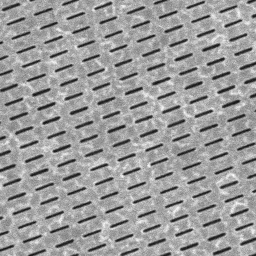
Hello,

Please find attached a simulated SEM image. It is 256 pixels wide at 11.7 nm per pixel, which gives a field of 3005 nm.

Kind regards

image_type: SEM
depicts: a regular array of holes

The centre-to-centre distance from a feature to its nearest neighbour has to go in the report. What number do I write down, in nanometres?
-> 175